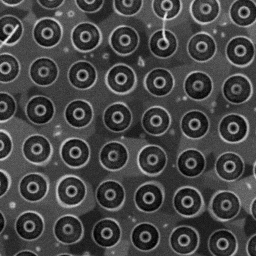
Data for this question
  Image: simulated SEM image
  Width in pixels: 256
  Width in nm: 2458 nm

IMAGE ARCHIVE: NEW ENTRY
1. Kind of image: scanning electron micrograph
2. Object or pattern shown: an array of small figures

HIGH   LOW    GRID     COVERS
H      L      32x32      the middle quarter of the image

HHLLLLLHHHHHHLLLHHHHHHHHHHHHHHHH
HLLLLLLLHHHLLLLLLHHHHHLLLLHHHHHH
HLLHHHLLHHHLLLHLLLHHHLLLLLLHHHHH
HLLHHHLLHHHLLHHHLLHHHLLHHLLHHHHL
HHLLLLLLHHHLLHHLLLHHLLLHHLLHHHLL
HHLLLLLHHHHLLLLLLLHHLLLHHLLHHHLL
HHHHHHHHHHHHLLLLLHHHHLLLLLLHHHLL
HHHHHHHHHHHHHHHHHHHHHHLLLLHHHHHL
HHHHHHHHHHHHHHHHHHHHHHHHHHHHHHHH
HHLLLLHHHHHHHHHHHHHHHHHHHHHHHHHH
HLLLLLLHHHHHLLLHHHHHHHHHHHHHHHHH
LLLHHLLHHHLLLLLLHHHHHLLLLHHHHHHH
LLHHHLLHHHLLLHLLLHHHLLLLLLHHHHHL
HLLHLLLHHHLLHHHLLHHHLLHHLLHHHHLL
HLLLLLHHHHLLLHLLLHHHLLHHLLLHHLLL
HHLLLHHHHHHLLLLLHHHHLLLLLLHHHLLH
HHHHHHHHHHHHLLLHHHHHLLLLLHHHHHLL
HHHHHHHHHHHHHHHHHHHHHHLLHHHHHHLL
HHHHHHHHHHHHHHHHHHHHHHHHHHHHHHHH
LLLLLHHHHHHHHHHHHHHHHHHHHHHHHHHH
LLLLLLHHHHLLLLLHHHHHHLLHHHHHHHHH
LLHHLLHHHLLLLLLLHHHLLLLLLHHHHHHL
LLHHLLHHHLLLHLLLHHHLLLLLLHHHHLLL
LLLLLLHHHLLHHLLLHHLLLHHLLLHHHLLL
LLLLLLHHHLLLLLLLHHHLLLHLLLHHLLLH
HLLLHHHHHHLLLLLHHHHLLLLLLHHHLLLH
HHHHHHHHHHHHLHHHHHHLLLLLLHHHHLLL
HHHHHHHHHHHHHHHHHHHHHLLHHHHHHHLL
LLLLHHHHHHHHHHHHHHHHHHHHHHHHHHHH
LLLLLHHHHHLLLHHHHHHHHHHHHHHHHHHH
LLLLLHHHHLLLLLHHHHHLLLLLHHHHHHHH
LHHLLHHHLLLLLLLHHHLLLLLLLHHHHLLL